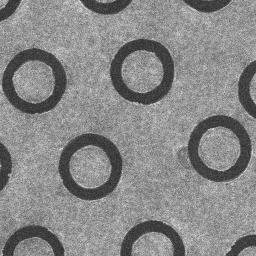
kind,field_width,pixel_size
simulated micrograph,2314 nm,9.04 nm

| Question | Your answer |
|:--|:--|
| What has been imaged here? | ring-shaped grooves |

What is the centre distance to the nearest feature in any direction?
944 nm